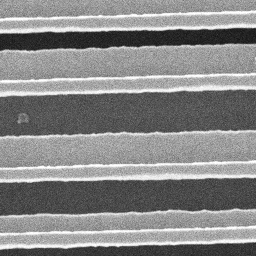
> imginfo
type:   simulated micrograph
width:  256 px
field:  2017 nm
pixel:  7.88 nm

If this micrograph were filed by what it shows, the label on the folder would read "lines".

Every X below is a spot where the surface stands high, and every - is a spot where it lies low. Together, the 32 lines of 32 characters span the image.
XXXXXXXXXXXXXXXXXXXXXXXXXXXXXXXX
XXXXXXXXXXXXXXXXXXXXXXXXXXXXXXXX
XXXXXXXXXXXXXXXXXXXXXXXXXXXXXXXX
XXXXXXXXXXXXXXXXXXXXXXXXXXXXX---
--------------------------------
----------------------------X---
XXXXXXXXXXXXXXXXXXXXXXXXXXXXXXXX
XXXXXXXXXXXXXXXXXXXXXXXXXXXXXXXX
XXXXXXXXXXXXXXXXXXXXXXXXXXXXXXXX
XXXXXXXXXXXXXXXXXXXXXXXXXXXXXXXX
XXXXXXXXXXXXXXXXXXXXXXXXXXXXXXXX
XXXXXXXXXXXXXXX-XX--------------
--------------------------------
--------------------------------
--------------------------------
--------------------------------
------------------------XXXXXXXX
XXXXXXXXXXXXXXXXXXXXXXXXXXXXXXXX
XXXXXXXXXXXXXXXXXXXXXXXXXXXXXXXX
XXXXXXXXXXXXXXXXXXXXXXXXXXXXXXXX
XXXXXXXXXXXXXXXXXXXXXXXXXXXXXXXX
XXXXXXXXXXXXXXXXXXXXXXXXXXXXXXXX
XXXXXXXXXXXXX-------------------
--------------------------------
--------------------------------
--------------------------------
--------------------XXXX-XXXXXXX
XXXXXXXXXXXXXXXXXXXXXXXXXXXXXXXX
XXXXXXXXXXXXXXXXXXXXXXXXXXXXXXXX
XXXXXXXXXXXXXXXXXXXXXXXXXXXXXXXX
XXXXXXXXXXXXXXXXXXXXXXX---------
--------------------------------